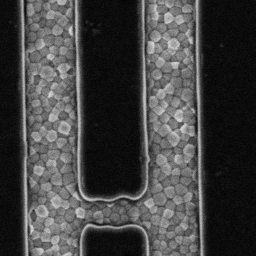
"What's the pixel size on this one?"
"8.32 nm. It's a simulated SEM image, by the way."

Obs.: one or a few lines or trenches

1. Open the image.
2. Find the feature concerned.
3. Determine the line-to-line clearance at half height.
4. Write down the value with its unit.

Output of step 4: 443 nm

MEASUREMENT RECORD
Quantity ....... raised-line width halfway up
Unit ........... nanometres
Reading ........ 558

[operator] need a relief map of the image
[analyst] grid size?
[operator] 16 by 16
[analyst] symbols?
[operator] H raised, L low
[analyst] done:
HLLLLHHHHLLLHHHH
HLLLLHHHHLLLHHHH
HLLLLHHHHLLLHHHH
HLLLLHHHHLLLHHHH
HLLLLHHHHLLLHHHH
HLLLLHHHHLLLHHHH
HLLLLHHHHLLLHHHH
HHLLLHHHHLLLHHHH
HHLLLHHHHLLLHHHH
HHLLLHHHHLLLHHHH
HHLLLHHHHLLLHHHH
HHLLLHHHHLLLHHHH
HHLLLLLLLLLLLHHH
HHLLLLLLLLLLLHHH
HHLLLHHHHLLLLHHH
HHLLLHHHHLLLLHHH